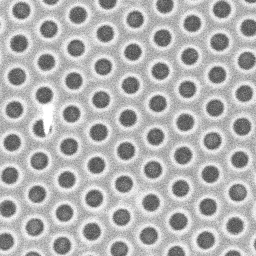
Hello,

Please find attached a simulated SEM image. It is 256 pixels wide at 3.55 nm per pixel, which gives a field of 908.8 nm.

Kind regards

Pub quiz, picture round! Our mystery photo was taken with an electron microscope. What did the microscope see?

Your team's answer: a regular array of holes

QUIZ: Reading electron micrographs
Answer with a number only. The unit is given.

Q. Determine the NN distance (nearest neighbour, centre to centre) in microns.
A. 0.116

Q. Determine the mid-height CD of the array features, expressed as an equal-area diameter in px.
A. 19.8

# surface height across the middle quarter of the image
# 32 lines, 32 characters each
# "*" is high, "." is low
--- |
*******.....**********....*****.
*******.....**********.....*****
*...****...***********....******
.....**********...****....******
.....*********.....**********...
.....*********.....**********...
*..***********.....*********....
*******....****...*****.*****...
*******.....**********....****..
*******.....*********.....******
*..****....**********.....******
....***********..****....*******
....**********....***********...
....*********......*********....
...***********....**********....
*******....***....**********....
******.....**********....***....
******.....**********....*******
...***.....*********.....*******
....****.*****...****....*******
....*********.....****..*****..*
....*********.....**********....
...**********.....*********.....
******....****...**********.....
******....***********...****....
******.....*********.....*******
.*****....**********.....*******
...****..***********.....*******
...**********....****...********
...**********....**********....*
...**********....**********....*
******...****....**********.....